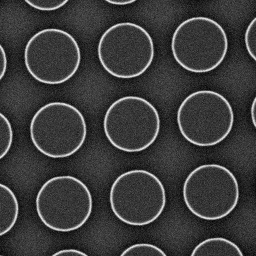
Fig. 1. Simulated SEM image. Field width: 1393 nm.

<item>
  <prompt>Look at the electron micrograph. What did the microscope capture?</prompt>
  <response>an array of small figures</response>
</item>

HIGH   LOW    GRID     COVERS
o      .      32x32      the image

....oooo.......o................
................................
.......................ooo......
..............oooo....oooooo...o
....ooooo....oooooo...oooooo...o
....oooooo..ooooooo...oooooo...o
o..ooooooo..ooooooo...oooooo...o
o..ooooooo...oooooo...oooooo....
o..ooooooo...ooooo.....oooo.....
....ooooo......oo...............
................................
.........................oo.....
...............ooo.....ooooo....
.....oooo.....ooooo...ooooooo...
....oooooo...ooooooo..ooooooo...
o...ooooooo..ooooooo..ooooooo...
o...ooooooo..ooooooo...oooooo...
o...oooooo....ooooo.....oooo....
o....ooooo.....ooo..............
......oo........................
................................
................oo......ooooo...
......oooo.....ooooo...oooooo...
o....oooooo...oooooo...ooooooo..
oo...oooooo...ooooooo..ooooooo..
oo...oooooo...ooooooo..oooooo...
oo...oooooo...oooooo....ooooo...
oo...oooooo....oooo.............
o.....oooo......................
................................
.........................oooo...
........oo......oooo....oooooo..